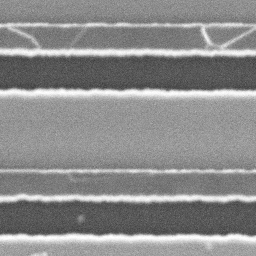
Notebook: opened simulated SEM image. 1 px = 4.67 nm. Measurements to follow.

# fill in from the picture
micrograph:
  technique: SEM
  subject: lines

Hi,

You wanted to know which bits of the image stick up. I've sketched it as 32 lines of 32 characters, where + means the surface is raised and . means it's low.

++++++++++++++++++++++++++++++++
++++++++++++++++++++++++++++++++
++++++++++++++++++++++++++++++++
++++++++++++++++++++++++++++++++
++++++++++++++++++++++++++++++++
++++++++++++++++++++++++++++++++
...+.................++..++.++++
................................
................................
................................
................................
.++.++.+.+.+++..+.+.............
++++++++++++++++++++++++++++++++
++++++++++++++++++++++++++++++++
++++++++++++++++++++++++++++++++
++++++++++++++++++++++++++++++++
++++++++++++++++++++++++++++++++
++++++++++++++++++++++++++++++++
++++++++++++++++++++++++++++++++
++++++++++++++++++++++++++++++++
++++++++++++++++++++++++++++++++
++++++++++++++++++++++++++++++++
++++++++++++++++++++++++++++++++
++++++++++++++++++++++++++++++++
++++++++++++++++++++++++++++++++
................................
................................
................................
................................
.........+...................+..
++++++++++++++++++++++++++++++++
++++++++++++++++++++++++++++++++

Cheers